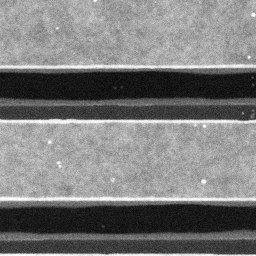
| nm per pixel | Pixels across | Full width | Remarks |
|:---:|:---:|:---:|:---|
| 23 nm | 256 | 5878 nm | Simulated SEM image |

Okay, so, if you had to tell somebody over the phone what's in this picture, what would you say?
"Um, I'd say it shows lines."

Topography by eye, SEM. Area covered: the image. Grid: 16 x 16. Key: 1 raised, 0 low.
1111111111111111
1111111111111111
1111111111111111
1111111111111111
0000000000000000
0000000000000000
0000000000000000
1111111111111111
1111111111111111
1111111111111111
1111111111111111
1111111111111111
1111111111111111
0000000000000000
0000000000000000
1111111111111111